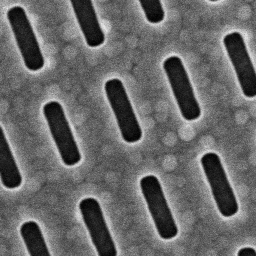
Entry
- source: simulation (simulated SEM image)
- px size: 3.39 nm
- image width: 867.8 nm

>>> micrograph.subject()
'holes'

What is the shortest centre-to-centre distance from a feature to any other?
0.221 microns